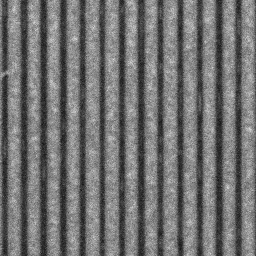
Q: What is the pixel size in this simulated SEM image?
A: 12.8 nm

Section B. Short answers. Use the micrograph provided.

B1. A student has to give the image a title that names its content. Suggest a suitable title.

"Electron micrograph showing parallel lines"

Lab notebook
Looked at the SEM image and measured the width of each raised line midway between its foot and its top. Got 164 nm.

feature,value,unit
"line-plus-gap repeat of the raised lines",249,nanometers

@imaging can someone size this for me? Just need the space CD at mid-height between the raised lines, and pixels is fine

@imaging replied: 6.88